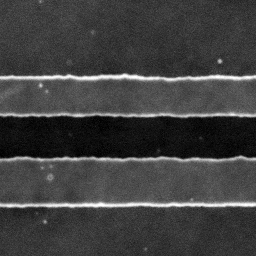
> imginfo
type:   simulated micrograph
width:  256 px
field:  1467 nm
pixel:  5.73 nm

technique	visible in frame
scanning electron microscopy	lines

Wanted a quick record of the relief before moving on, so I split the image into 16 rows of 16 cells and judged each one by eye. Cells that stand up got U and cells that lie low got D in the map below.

DDDDDDDDDDDDDDDD
DDDDDDDDDDDDDDDD
DDDDDDDDDDDDDDDD
DDDDDDDDDDDDDDDD
DDDDDDDDDDDDDDDD
UUUUUUUUUUUUUUUU
UUUUUUUUUUUUUUUU
DDDDDDDDDDDDDDDD
DDDDDDDDDDDDDDDD
DDDDDDDDDDDDDDDD
UUUUUUUUUUUUUUUU
UUUUUUUUUUUUUUUU
UUUUUUUUUUUUUUUU
DDDDDDDDDDDDDDDD
DDDDDDDDDDDDDDDD
DDDDDDDDDDDDDDDD